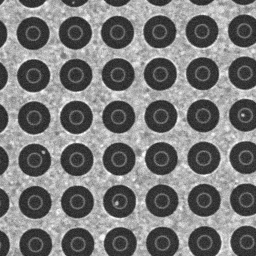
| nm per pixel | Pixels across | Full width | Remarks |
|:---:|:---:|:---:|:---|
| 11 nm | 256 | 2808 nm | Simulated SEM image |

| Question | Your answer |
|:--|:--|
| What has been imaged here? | an array of small figures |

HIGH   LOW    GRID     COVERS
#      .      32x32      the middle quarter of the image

.......###.......###........###.
.......##.........##........##..
.......##.........##........##..
.......##.........##........###.
.......###.......###........###.
......####.......####......#####
#....#######...########..#######
################################
################################
#....#######....######....######
......#####......####.......###.
.......###.......###........###.
.......##.........##.........#..
.......##.........##.........#..
.......###........##........###.
.......###.......####.......###.
......#####.....######.....#####
##..#########.##################
################################
########################.#######
#.....#####.....#####......#####
.......###.......####.......###.
.......###........##........###.
........#.........##.........##.
........##........##........###.
.......###........###.......###.
.......###.......####......#####
#.....######....######....######
################################
################################
##...#######....######....######
......#####......####.......####